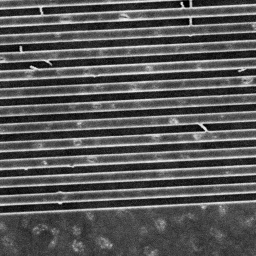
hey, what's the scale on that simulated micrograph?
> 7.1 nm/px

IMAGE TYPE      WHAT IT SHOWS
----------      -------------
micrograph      parallel lines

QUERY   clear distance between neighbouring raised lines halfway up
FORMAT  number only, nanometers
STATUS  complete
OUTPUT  56.7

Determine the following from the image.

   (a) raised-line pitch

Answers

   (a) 127 nm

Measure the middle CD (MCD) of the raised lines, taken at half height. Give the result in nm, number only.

70.9